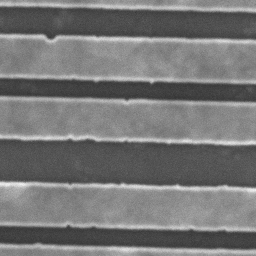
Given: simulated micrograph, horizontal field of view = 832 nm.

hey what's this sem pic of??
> one or a few lines or trenches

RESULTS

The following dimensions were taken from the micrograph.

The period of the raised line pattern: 240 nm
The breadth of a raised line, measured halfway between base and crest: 134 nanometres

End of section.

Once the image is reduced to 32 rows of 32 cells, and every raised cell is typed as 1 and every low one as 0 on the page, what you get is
11111111111111111111111111111111
00000000000000000000000000000000
00000000000000000000000000000000
00000000000000000000000000000000
11000000000000000000000000000000
11111111111111111111111111111111
11111111111111111111111111111111
11111111111111111111111111111111
11111111111111111111111111111111
11111111111111111111111111111111
00000000000000000000000000000000
00000000000000000000000000000000
11111111111100000000000000000000
11111111111111111111111111111111
11111111111111111111111111111111
11111111111111111111111111111111
11111111111111111111111111111111
00000000000010001011111111111111
00000000000000000000000000000000
00000000000000000000000000000000
00000000000000000000000000000000
00000000000000000000000000000000
00000000000000000000000000000000
11111111111111111111111000000000
11111111111111111111111111111111
11111111111111111111111111111111
11111111111111111111111111111111
11111111111111111111111111111111
00000000000000000000111111111111
00000000000000000000000000000000
00000000000000000000000000000000
11111111111111111111111111111111